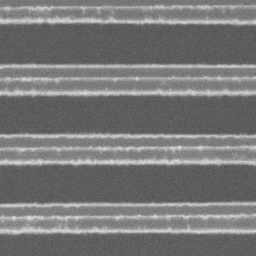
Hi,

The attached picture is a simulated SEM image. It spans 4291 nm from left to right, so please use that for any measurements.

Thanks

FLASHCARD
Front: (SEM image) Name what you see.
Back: lines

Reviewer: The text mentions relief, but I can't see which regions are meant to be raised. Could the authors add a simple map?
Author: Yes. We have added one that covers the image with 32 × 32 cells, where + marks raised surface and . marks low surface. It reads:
++++++++++++++++++++++++++++++++
++++++++++++++++++++++++++++++++
++++++++++++++++++++++++++++++++
................................
................................
................................
................................
................................
++++++++++++++++++++++++++++++++
++++++++++++++++++++++++++++++++
++++++++++++++++++++++++++++++++
++++++++++++++++++++++++++++++++
................................
................................
................................
................................
................................
++++++++++++++++++++++++++++++++
++++++++++++++++++++++++++++++++
++++++++++++++++++++++++++++++++
................................
................................
................................
................................
................................
................................
++++++++++++++++++++++++++++++++
++++++++++++++++++++++++++++++++
++++++++++++++++++++++++++++++++
................................
................................
................................